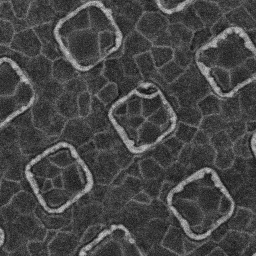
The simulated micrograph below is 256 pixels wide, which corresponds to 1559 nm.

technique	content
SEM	raised bodies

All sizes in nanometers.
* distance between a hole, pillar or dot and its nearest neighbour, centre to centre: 615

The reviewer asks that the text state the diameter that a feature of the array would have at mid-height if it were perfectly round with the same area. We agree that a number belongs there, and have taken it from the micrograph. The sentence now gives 0.383 microns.